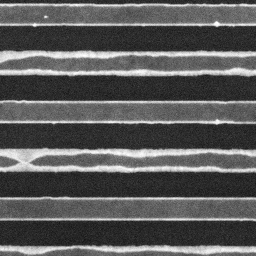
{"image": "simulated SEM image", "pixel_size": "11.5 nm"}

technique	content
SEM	lines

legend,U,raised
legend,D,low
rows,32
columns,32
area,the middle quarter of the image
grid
UUUUUUUUUUUUUUUUUUUUUUUUUUUUUUUU
UUUUUUUUUUUUUUUUUUUUUUUUUUUUUUUU
DUDDDDDDDDDDDDDDDDDDDDDDDDDDDDDD
DDDDDDDDDDDDDDDDDDDDDDDDDDDDDDDD
DDDDDDDDDDDDDDDDDDDDDDDDDDDDDDDD
DDDDDDDDDDDDDDDDDDDDDDDDDDDDDDDD
DDDDDDDDDDDDDDDDDDDDDDDDDDDDDDDD
DDDDDDDDDDDDDDDDDDDDDDDDDDDDDDDD
DDDDDDDDDDDDDDDDDDDDDDDDDDDDDDDD
UUUUUUUUUDUUUUUUUUUUUUUUUUUUUUUU
UUUUUUUUUUUUUUUUUUUUUUUUUUUUUUUU
UUUUUUUUUUUUUUUUUUUUUUUUUUUUUUUU
UUUUUUUUUUUUUUUUUUUUUUUUUUUUUUUU
UUUUUUUUUUUUUUUUUUUUUUUUUUUUUUUU
UUUUUUUUUUUUUUUUUUUUUUUUUUUUUUUU
DDDDDDDDDDDDDDDDDDDDDDDDDDDDDDDD
DDDDDDDDDDDDDDDDDDDDDDDDDDDDDDDD
DDDDDDDDDDDDDDDDDDDDDDDDDDDDDDDD
DDDDDDDDDDDDDDDDDDDDDDDDDDDDDDDD
DDDDDDDDDDDDDDDDDDDDDDDDDDDDDDDD
DDDDDDDDDDDDDDDDDDDDDDDDDDDDDDDD
DDDDDDDDDDDDDDDDDDDDDDDDDDDDDDDD
UUUUUUUUUUUUUUUUUUUUUUUUUUUUUUUU
UUUUUUUUUUUUUUUUUUUUUUUUUUUUUUUU
UUUUUUUUUUUUUUUUUUUUUUUUUUUUUUUU
UUUUUUUUUUUUUUUUUUUUUUUUUUUUUUUU
DDDDUDUUDDDDDDUUUUUUDDDDDDDDDDDU
DDDDDDDDDDDDDDDDDDDDDDDDDDDDDDDD
DDDDDDDDDDDDDDDDDDDDDDDDDDDDDDDD
DDDDDDDDDDDDDDDDDDDDDDDDDDDDDDDD
DDDDDDDDDDDDDDDDDDDDDDDDDDDDDDDD
DDDDDDDDDDDDDDDDDDDDDDDDDDDDDDDD